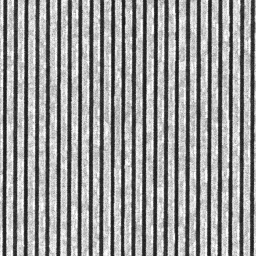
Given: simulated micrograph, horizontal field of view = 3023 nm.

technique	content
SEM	parallel lines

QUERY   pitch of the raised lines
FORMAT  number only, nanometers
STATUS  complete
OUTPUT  127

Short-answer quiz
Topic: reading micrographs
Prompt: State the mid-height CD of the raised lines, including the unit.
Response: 81.2 nm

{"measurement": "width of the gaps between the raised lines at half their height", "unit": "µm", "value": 0.0517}